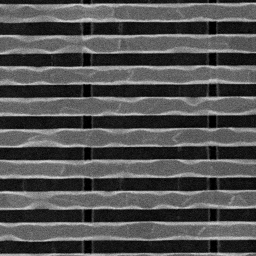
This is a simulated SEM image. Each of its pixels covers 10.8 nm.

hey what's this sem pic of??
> wiring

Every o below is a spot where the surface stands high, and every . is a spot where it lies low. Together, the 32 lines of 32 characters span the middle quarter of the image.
................................
oooooooooooooooooooooooooooooooo
oooooooooooooooooooooooooooooooo
oooooooooooooooooooooooooooooooo
oooooooooooooooooooooooooooooooo
................................
................................
................................
oo...oooo..........ooooooo......
oooooooooooooooooooooooooooooooo
oooooooooooooooooooooooooooooooo
oooooooooooooooooooooooooooooooo
ooooooooooo.oooooooooooooo....oo
................................
................................
................................
oo.....ooo.......oooo.....oooooo
oooooooooooooooooooooooooooooooo
oooooooooooooooooooooooooooooooo
oooooooooooooooooooooooooooooooo
.....oooooo............ooooo....
................................
................................
................................
......ooooooooooooooooooooooooo.
oooooooooooooooooooooooooooooooo
oooooooooooooooooooooooooooooooo
oooooooooooooooooooooooooooooooo
................................
................................
................................
................................